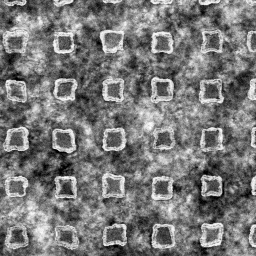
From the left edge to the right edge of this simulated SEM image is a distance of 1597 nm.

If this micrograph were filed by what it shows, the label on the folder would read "a regular array of raised bodies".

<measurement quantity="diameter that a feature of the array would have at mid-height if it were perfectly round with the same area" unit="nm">145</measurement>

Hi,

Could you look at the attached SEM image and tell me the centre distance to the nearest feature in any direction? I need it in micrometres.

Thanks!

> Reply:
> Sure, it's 0.298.